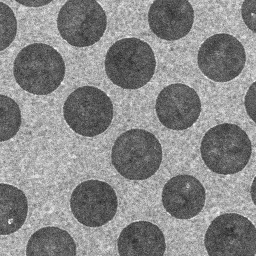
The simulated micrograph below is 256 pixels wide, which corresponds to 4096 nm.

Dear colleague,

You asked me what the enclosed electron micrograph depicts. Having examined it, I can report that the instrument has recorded a regular array of holes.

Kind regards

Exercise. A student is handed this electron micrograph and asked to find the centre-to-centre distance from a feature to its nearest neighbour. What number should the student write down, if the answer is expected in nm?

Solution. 1020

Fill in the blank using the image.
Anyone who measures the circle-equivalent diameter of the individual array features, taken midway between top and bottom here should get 821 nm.